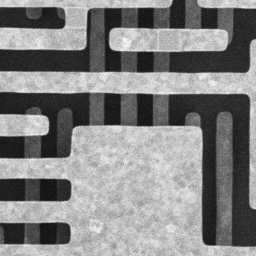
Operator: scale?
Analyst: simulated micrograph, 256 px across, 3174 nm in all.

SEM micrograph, wiring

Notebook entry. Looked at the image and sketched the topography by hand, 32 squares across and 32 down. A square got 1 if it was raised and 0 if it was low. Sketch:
11111111111111111111100001111111
00000000111000000000000000000000
00000000111000000000000000000000
00000000111000000000000000000000
11111111111000111111111111110000
11111111111000111111111111110001
00000000000000000000000000000001
00000000000000000000000000000001
00000000000000000000000000000001
11111111111111111111111111111111
11111111111111111111111111111111
00111111111111111111111111111111
00000000000000000000000000000001
00000000000000000000000000000001
11111000000000000000000000000001
11111100000000000000000000000001
11111100011111111111111110000001
00000000011111111111111110000001
00000000011111111111111110000001
00000000011111111111111110000001
11111111111111111111111110000001
11111111111111111111111110000001
00000000111111111111111110000001
00000000011111111111111110000001
00000000011111111111111110000001
11111111111111111111111110000001
11111111111111111111111110000000
11111111111111111111111110000000
00000000011111111111111110000000
00000000011111111111111110000000
00000000111111111111111111000000
11111111111111111111111111111111